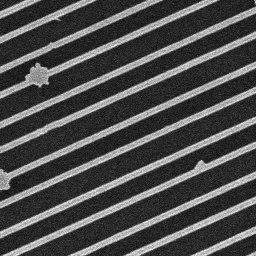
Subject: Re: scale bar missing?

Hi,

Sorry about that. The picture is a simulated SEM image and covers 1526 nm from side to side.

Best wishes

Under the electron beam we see parallel lines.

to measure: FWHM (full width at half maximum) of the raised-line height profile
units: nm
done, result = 29.9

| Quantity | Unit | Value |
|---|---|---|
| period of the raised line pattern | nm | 149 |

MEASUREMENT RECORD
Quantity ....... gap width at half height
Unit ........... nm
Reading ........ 110